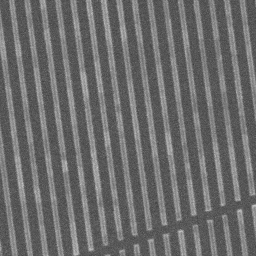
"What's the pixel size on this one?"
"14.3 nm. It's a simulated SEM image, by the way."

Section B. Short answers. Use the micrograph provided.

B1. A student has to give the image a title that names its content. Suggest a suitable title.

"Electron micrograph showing parallel lines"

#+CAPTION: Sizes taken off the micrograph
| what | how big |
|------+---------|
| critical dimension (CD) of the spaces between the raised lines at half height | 167 nm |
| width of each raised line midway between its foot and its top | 55 nm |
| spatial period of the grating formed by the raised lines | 218 nanometers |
